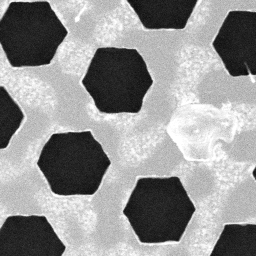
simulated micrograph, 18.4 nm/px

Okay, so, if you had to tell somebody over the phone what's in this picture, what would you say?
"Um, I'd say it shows holes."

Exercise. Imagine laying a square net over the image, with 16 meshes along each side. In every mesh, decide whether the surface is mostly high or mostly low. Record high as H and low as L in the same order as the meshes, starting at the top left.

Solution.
LLLHHHHHLLLLHHHH
LLLLHHHHHLLLHHLL
LLLLHHHHHHHHHLLL
LLLHHHLLLHHHHHLL
HHHHHLLLLHHHHHLL
HHHHHLLLLHHHHHHH
LHHHHHLLLHHHHHHH
LHHHHHHHHHHHHHHH
LHHLLLHHHHHHHHHH
HHHLLLLHHHHHHHHH
HHLLLLLHHHHHHHHH
HHHLLLHHHLLHHHHH
HHHHHHHHLLLLHHHH
HLLHHHHHLLLLHHHH
LLLHHHHHLLLLHHLL
LLLLHHHHHHHHHLLL